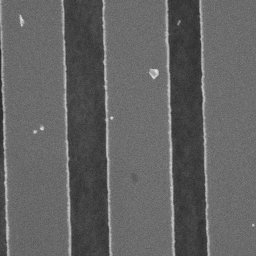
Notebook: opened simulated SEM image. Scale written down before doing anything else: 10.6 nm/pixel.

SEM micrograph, lines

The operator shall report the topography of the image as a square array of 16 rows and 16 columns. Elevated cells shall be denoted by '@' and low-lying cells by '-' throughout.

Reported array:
@@@@--@@@@---@@@
@@@@--@@@@---@@@
@@@@--@@@@@--@@@
@@@@--@@@@@--@@@
@@@@---@@@@--@@@
@@@@---@@@@--@@@
@@@@---@@@@--@@@
@@@@---@@@@--@@@
@@@@---@@@@--@@@
@@@@---@@@@--@@@
@@@@---@@@@--@@@
@@@@---@@@@--@@@
@@@@---@@@@--@@@
@@@@---@@@@--@@@
@@@@---@@@@--@@@
@@@@---@@@@--@@@